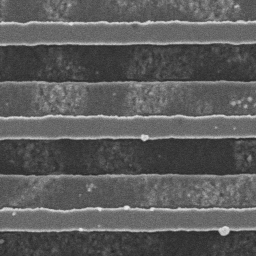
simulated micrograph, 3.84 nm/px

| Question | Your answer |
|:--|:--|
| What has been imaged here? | lines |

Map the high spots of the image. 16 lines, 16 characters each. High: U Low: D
UUUUUUUUUUUUUUUU
UUUUUUUUUUUUUUUU
UUUUUUUUUUUUUUUU
DDDDDDDDDDDDDDDD
DDDDDDDDDDDDDDDD
UUUUUUUUUUUUUUUU
UUUUUUUUUUUUUUUU
UUUUUUUUUUUUUUUU
UUUUUUUUUUUUUUUU
DDDDDDDDDDDDDDDD
DDDDDDDDDDDDDDDD
UUUUUUUUUUUUUUUU
UUUUUUUUUUUUUUUU
UUUUUUUUUUUUUUUU
DDDDDDDDDDDDDDDD
DDDDDDDDDDDDDDDD